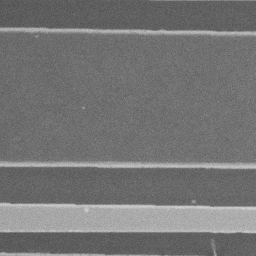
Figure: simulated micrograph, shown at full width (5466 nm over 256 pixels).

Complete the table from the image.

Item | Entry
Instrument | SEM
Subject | lines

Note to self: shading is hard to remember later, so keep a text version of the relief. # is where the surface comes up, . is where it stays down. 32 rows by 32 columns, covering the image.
................................
................................
................................
................................
################################
################################
################################
################################
################################
################################
################################
################################
################################
################################
################################
################################
################################
################################
################################
################################
################################
................................
................................
................................
................................
................................
################################
################################
################################
................................
................................
................................